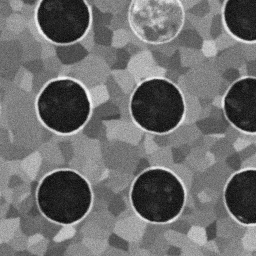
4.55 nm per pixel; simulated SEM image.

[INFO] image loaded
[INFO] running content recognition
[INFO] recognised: holes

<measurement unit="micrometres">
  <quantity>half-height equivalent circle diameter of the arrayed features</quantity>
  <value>0.247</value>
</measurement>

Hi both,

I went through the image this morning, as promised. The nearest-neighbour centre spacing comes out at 411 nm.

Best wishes